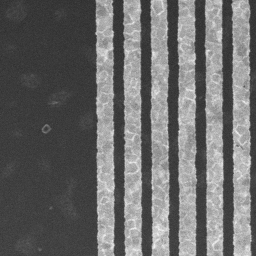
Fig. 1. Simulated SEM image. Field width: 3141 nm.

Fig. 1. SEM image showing parallel lines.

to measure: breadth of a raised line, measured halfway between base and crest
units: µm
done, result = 0.187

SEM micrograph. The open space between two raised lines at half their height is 140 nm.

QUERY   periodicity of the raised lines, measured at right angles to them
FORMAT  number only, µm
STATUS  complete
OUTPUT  0.334